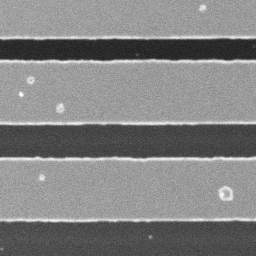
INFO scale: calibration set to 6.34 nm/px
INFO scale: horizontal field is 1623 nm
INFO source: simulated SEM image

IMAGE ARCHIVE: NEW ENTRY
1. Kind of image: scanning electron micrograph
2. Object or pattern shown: lines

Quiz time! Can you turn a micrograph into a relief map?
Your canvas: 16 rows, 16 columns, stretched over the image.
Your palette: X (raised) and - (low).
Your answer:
XXXXXXXXXXXXXXXX
XXXXXXXXXXXXXXXX
----------------
----------------
XXXXXXXXXXXXXXXX
XXXXXXXXXXXXXXXX
XXXXXXXXXXXXXXXX
XXXXXXXXXXXXXXXX
----------------
----------------
XXXXXXXXXXXXXXXX
XXXXXXXXXXXXXXXX
XXXXXXXXXXXXXXXX
XXXXXXXXXXXXXXXX
----------------
----------------